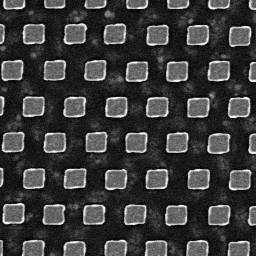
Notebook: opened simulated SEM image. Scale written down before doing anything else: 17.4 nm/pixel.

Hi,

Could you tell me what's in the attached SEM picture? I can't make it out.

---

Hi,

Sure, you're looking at a regular array of raised bodies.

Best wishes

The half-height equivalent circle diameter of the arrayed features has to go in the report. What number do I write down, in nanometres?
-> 384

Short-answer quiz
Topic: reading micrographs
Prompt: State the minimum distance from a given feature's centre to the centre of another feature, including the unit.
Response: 706 nanometers